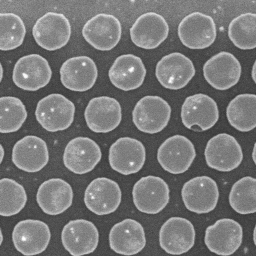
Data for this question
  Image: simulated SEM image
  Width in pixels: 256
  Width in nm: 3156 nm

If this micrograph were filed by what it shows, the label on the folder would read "a regular array of raised bodies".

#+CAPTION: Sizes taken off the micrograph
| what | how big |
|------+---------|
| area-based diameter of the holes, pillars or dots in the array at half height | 456 nm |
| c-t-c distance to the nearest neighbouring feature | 576 nm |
